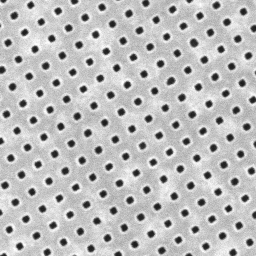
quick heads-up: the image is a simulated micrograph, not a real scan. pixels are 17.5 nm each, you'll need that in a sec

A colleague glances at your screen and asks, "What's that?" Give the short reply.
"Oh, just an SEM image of a regular array of holes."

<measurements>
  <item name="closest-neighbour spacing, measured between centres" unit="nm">340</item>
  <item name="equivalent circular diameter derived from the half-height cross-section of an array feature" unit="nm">149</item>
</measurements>